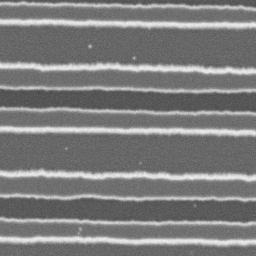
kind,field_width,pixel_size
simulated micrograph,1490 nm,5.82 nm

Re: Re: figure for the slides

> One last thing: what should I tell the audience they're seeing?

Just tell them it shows lines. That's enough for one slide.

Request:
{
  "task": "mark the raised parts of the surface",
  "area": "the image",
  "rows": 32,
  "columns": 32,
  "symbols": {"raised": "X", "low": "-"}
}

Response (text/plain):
X-XX----------------------------
XXXXXXXXXXXXXXXXXXXXXXXXXXXXXXXX
XXXXXXXXXXXXXXXXXXXXXXXXXXXXXXXX
--------------------------------
--------------------------------
--------------------------------
--------------------------------
--------------------------------
XXXXX-XXXXXXXXX-----------------
XXXXXXXXXXXXXXXXXXXXXXXXXXXXXXXX
XXXXXXXXXXXXXXXXXXXXXXXXXXXXXXXX
--------------------------------
--------------------------------
--------------------------------
XXXXXXXXXXXXXXXXXXXXXXXXXXXXXXXX
XXXXXXXXXXXXXXXXXXXXXXXXXXXXXXXX
-----------------------------XXX
--------------------------------
--------------------------------
--------------------------------
--------------------------------
--------------------------------
XXXXXXXXXXXXXXXXXXXXXXXXXXXXXXXX
XXXXXXXXXXXXXXXXXXXXXXXXXXXXXXXX
XX-XXXXXXXXXXXXXXXXXXXXXXXXXXXXX
--------------------------------
--------------------------------
X-------------------------------
XXXXXXXXXXXXXXXXXXXXXXXXXXXXXXXX
XXXXXXXXXXXXXXXXXXXXXXXXXXXXXXXX
--------------------------------
--------------------------------